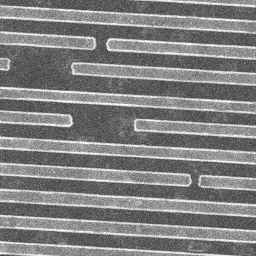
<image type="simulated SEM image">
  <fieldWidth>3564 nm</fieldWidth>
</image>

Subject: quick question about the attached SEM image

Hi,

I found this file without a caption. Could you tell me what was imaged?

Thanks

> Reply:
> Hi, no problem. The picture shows parallel lines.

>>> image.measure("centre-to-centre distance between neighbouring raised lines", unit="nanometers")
364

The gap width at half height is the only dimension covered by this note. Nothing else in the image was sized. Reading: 210 nanometers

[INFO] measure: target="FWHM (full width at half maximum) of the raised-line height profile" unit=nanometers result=158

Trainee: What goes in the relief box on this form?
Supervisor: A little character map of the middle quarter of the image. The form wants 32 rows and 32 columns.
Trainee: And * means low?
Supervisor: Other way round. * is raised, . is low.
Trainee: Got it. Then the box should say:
..*************.................
..*****************************.
....****************************
.....................***********
................................
................................
................................
********........................
*************************.......
.*******************************
.....................***********
................................
................................
**..............................
**................*********.....
*.................**************
..................**************
................................
................................
................................
*****************..*............
********************************
..........**********************
..........................******
................................
................................
**********......................
**************************......
********************************
................****************
................................
................................